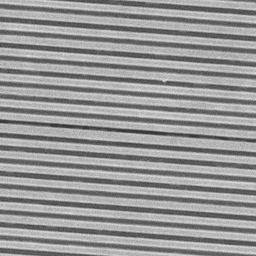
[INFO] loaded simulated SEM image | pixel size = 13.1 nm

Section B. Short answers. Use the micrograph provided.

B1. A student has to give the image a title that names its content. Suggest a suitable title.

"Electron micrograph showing parallel lines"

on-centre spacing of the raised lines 168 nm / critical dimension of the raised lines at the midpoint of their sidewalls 91.3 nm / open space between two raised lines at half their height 79.9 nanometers